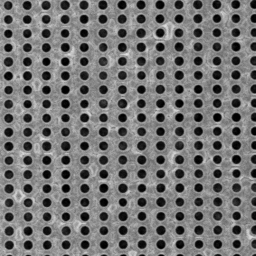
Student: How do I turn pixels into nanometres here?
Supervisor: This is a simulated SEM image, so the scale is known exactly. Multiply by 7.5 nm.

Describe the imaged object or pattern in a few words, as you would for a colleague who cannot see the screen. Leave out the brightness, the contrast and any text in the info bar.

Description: a regular array of holes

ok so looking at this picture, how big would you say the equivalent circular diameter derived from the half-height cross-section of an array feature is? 67.1 nm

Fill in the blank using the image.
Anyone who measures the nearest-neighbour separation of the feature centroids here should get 105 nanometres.